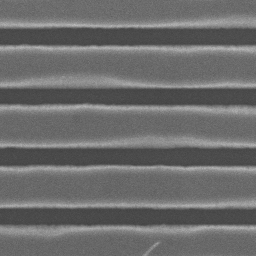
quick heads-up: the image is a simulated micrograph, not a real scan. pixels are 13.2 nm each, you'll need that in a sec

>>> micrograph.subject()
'lines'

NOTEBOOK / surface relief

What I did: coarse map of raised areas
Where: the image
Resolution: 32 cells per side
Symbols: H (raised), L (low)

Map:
HHHHHHHHHHHHHHHHHHHHHHHHHHHHHHHH
HHHHHHHHHHHHHHHHHHHHHHHHHHHHHHHH
HHHHHHHHHHHHHHHHHHHHHHHHHHHHHHHH
LLLLLLLLLLLLLLLLLLLLLLLLLLLLLLLL
LLLLLLLLLLLLLLLLLLLLLLLLLLLLLLLL
LLLLLLLLLLLLLLLLLLLLLLLLLLLLLLLL
HHHHHHHHHHHHHHHHHHHHHHHHHHHHHHHH
HHHHHHHHHHHHHHHHHHHHHHHHHHHHHHHH
HHHHHHHHHHHHHHHHHHHHHHHHHHHHHHHH
HHHHHHHHHHHHHHHHHHHHHHHHHHHHHHHH
HHHHHHHHHHHHHHHHHHHHHHHHHHHHHHHH
LLLLLLLLLLLLLLLLLLLLLLLLLLLLLLLL
LLLLLLLLLLLLLLLLLLLLLLLLLLLLLLLL
HHHHHHHHHHHHHHHHHHHHHHHHHHHHHHHH
HHHHHHHHHHHHHHHHHHHHHHHHHHHHHHHH
HHHHHHHHHHHHHHHHHHHHHHHHHHHHHHHH
HHHHHHHHHHHHHHHHHHHHHHHHHHHHHHHH
HHHHHHHHHHHHHHHHHHHHHHHHHHHHHHHH
LLLLLLLLLLLLLLLLLLLLLLLLLLLLLLLL
LLLLLLLLLLLLLLLLLLLLLLLLLLLLLLLL
LLLLLLLLLLLLLLLLLLLLLLLLLLLLLLLL
HHHHHHHHHHHHHHHHHHHHHHHHHHHHHHHH
HHHHHHHHHHHHHHHHHHHHHHHHHHHHHHHH
HHHHHHHHHHHHHHHHHHHHHHHHHHHHHHHH
HHHHHHHHHHHHHHHHHHHHHHHHHHHHHHHH
HHHHHHHHHHHHHHHHHHHHHHHHHHHHHHHH
LLLLLLLLLLLLLLLLLLLLLLLLLLLLLLLL
LLLLLLLLLLLLLLLLLLLLLLLLLLLLLLLL
HHHHHHHHHHHHHHHHHHHHHHHHHHHHHHHH
HHHHHHHHHHHHHHHHHHHHHHHHHHHHHHHH
HHHHHHHHHHHHHHHHHHHHHHHHHHHHHHHH
HHHHHHHHHHHHHHHHHHHHHHHHHHHHHHHH